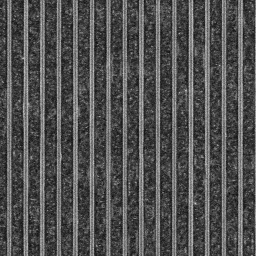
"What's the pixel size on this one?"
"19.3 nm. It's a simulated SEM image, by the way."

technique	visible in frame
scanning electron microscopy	parallel lines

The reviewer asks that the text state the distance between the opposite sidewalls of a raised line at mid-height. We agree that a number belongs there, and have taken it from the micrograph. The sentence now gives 53 nm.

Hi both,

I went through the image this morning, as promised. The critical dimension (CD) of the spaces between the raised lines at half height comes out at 13.5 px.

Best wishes